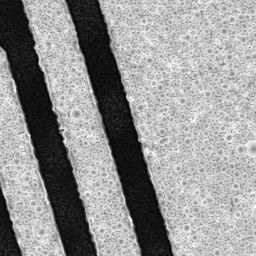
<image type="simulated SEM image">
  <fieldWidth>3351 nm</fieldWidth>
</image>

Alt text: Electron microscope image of one or a few lines or trenches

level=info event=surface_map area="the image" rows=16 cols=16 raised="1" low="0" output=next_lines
0011001111111111
0011100111111111
0011100111111111
0011100111111111
1001100111111111
1001110011111111
1001110011111111
1100110011111111
1100111001111111
1100111001111111
1100011001111111
1110011100111111
1110011100111111
0110011100111111
0111001100111111
0111001110011111